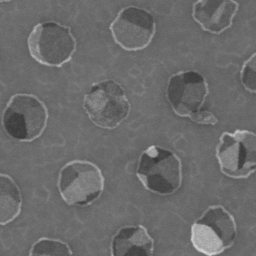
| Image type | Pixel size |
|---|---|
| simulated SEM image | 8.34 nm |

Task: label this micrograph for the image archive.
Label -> raised bodies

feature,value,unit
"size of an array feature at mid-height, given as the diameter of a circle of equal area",372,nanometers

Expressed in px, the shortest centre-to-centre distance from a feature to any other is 80.1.